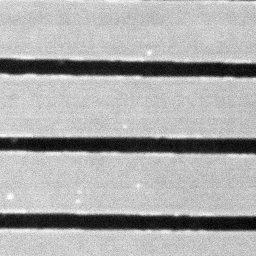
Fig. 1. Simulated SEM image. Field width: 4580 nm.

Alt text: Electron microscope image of lines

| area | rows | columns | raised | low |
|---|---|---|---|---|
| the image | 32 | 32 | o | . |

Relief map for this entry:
oooooooooooooooooooooooooooooooo
oooooooooooooooooooooooooooooooo
oooooooooooooooooooooooooooooooo
oooooooooooooooooooooooooooooooo
oooooooooooooooooooooooooooooooo
oooooooooooooooooooooooooooooooo
oooooooooooooooooooooooooooooooo
.............ooooooooooooooooooo
................................
ooooooooo.ooo...................
oooooooooooooooooooooooooooooooo
oooooooooooooooooooooooooooooooo
oooooooooooooooooooooooooooooooo
oooooooooooooooooooooooooooooooo
oooooooooooooooooooooooooooooooo
oooooooooooooooooooooooooooooooo
oooooooooooooooooooooooooooooooo
................................
................................
oooooooooooooooooooooooooooooooo
oooooooooooooooooooooooooooooooo
oooooooooooooooooooooooooooooooo
oooooooooooooooooooooooooooooooo
oooooooooooooooooooooooooooooooo
oooooooooooooooooooooooooooooooo
oooooooooooooooooooooooooooooooo
oooooooooooooooooooooooooooooooo
................................
................................
oooooooooooooooooooooooooooooooo
oooooooooooooooooooooooooooooooo
oooooooooooooooooooooooooooooooo